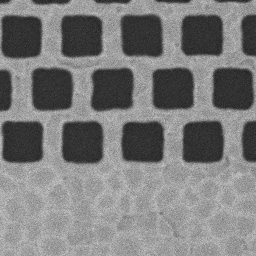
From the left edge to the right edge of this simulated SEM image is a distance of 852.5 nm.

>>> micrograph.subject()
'a regular array of holes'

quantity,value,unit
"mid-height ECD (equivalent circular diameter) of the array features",149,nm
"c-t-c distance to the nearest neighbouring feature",200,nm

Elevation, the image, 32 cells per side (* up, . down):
*****...************************
********************************
.....***.....**.....***.....**..
.....***.....**.....***.....**..
.....***.....**.....***.....**..
.....***.....**.....***.....**..
.....***.....***....***.....**..
********************************
**********************.*****.***
.***.....***.....**.....***.....
.***.....***.....**.....***.....
.***.....***.....**.....***.....
.***.....**......**.....***.....
.***....****....****....***....*
********************************
*....***....****....***.....***.
.....***.....**.....***.....**..
.....***.....**......**.....**..
.....***.....**......**.....**..
.....***.....**.....***.....***.
********************************
********************************
********************************
********************************
********************************
********************************
********************************
********************************
********************************
********************************
********************************
********************************